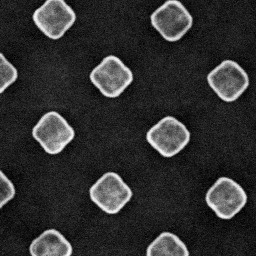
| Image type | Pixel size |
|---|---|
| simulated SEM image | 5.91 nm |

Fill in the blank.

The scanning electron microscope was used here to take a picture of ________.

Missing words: raised bodies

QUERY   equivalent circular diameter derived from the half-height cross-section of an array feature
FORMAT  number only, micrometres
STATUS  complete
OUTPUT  0.217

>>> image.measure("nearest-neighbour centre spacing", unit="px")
81